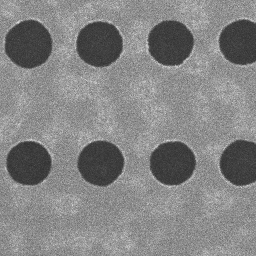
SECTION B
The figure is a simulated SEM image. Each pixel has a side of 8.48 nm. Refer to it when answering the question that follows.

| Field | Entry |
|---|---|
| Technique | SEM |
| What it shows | holes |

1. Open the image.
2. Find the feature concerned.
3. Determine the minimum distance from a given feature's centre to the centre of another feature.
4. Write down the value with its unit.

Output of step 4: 606 nm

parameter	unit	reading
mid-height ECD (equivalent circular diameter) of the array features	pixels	46.5